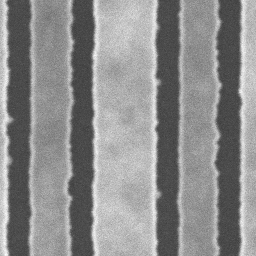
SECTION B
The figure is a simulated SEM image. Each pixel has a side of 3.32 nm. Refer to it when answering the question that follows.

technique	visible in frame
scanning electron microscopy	lines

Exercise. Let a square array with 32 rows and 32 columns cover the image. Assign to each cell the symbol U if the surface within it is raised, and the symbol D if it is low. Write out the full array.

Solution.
UDDDUUUUUDDDUUUUUUUUDDDUUUUDDDUU
UDDDUUUUUDDDUUUUUUUDDDUUUUUDDDUU
UDDDUUUUUDDDUUUUUUUDDDUUUUUDDDUU
UDDDUUUUUDDDUUUUUUUDDDUUUUUDDDUU
UDDDUUUUUDDDUUUUUUUDDDUUUUUDDDUU
UDDDUUUUUDDDUUUUUUUDDDDUUUUDDDUU
UDDDUUUUUDDDUUUUUUUDDDDUUUUDDDUU
UDDDUUUUUDDDUUUUUUUDDDUUUUUDDDUU
UDDDUUUUUDDDUUUUUUUDDDUUUUUDDDUU
UDDDUUUUUDDDUUUUUUUDDDUUUUUDDDUU
UDDDUUUUUDDDUUUUUUUDDDUUUUUUDDUU
UDDDUUUUUDDDUUUUUUUDDDUUUUUDDDUU
UDDDUUUUUDDDUUUUUUUDDDUUUUUDDDUU
UDDDUUUUUDDDUUUUUUUDDDUUUUUDDDUU
UDDDUUUUUDDDUUUUUUUDDDUUUUUDDDUU
UDDDUUUUUDDDUUUUUUUDDDUUUUUDDDUU
UDDDUUUUUDDDUUUUUUUDDDUUUUUDDDUU
UDDDUUUUUDDDUUUUUUUUDDUUUUUDDDUU
UDDDUUUUUDDDUUUUUUUDDDUUUUUDDDUU
UDDDUUUUUDDDUUUUUUUDDDUUUUUDDDUU
UDDDUUUUUDDDUUUUUUUDDDUUUUUDDDUU
UDDDUUUUUDDDUUUUUUUDDDUUUUUDDDUU
UDDDUUUUUDDDUUUUUUUDDDUUUUUDDDUU
UDDDUUUUDDDDUUUUUUUDDDUUUUUDDDUU
UDDDUUUUUDDDUUUUUUUDDDUUUUUDDDUU
UDDDUUUUUDDDUUUUUUUDDDUUUUUDDDUU
UDDDUUUUUDDDUUUUUUUDDDUUUUUDDDUU
UDDDUUUUUDDDUUUUUUUDDDUUUUUDDDUU
UDDDUUUUUDDDUUUUUUUDDDUUUUUDDDUU
UDDDUUUUUDDDUUUUUUUDDDUUUUUDDDUU
UDDDUUUUUDDDUUUUUUUDDDUUUUUDDDUU
UDDDUUUUUDDDUUUUUUUDDDUUUUUDDDUU